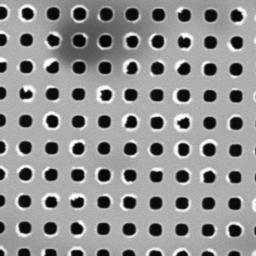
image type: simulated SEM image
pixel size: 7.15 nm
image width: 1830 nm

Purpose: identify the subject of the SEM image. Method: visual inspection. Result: a regular array of holes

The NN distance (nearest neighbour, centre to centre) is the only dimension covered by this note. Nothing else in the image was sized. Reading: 26 px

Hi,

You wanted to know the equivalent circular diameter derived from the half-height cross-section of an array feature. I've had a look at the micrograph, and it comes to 13.1 px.